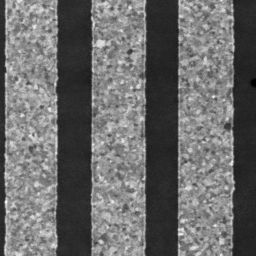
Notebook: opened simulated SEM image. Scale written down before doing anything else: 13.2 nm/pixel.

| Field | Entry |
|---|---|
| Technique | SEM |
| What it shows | one or a few lines or trenches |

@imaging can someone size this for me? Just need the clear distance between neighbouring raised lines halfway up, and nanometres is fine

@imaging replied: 469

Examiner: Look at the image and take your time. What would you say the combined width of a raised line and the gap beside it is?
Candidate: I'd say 1160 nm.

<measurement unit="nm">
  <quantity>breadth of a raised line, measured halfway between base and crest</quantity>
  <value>691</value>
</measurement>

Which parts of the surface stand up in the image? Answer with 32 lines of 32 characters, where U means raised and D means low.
DUUUUUUDDDDDUUUUUUDDDDDUUUUUUDDD
DUUUUUUDDDDDUUUUUUDDDDDUUUUUUDDD
DUUUUUUDDDDDUUUUUUDDDDDUUUUUUDDD
DUUUUUUDDDDDUUUUUUDDDDUUUUUUUDDD
DUUUUUUDDDDDUUUUUUDDDDUUUUUUUDDD
DUUUUUUDDDDDUUUUUUDDDDUUUUUUUDDD
DUUUUUUDDDDDUUUUUUDDDDUUUUUUUDDD
DUUUUUUDDDDDUUUUUUDDDDUUUUUUUDDD
DUUUUUUDDDDDUUUUUUDDDDUUUUUUUDDD
DUUUUUUDDDDDUUUUUUDDDDUUUUUUUDDD
DUUUUUUDDDDDUUUUUUDDDDUUUUUUUDDD
DUUUUUUDDDDDUUUUUUDDDDUUUUUUUDDD
DUUUUUUDDDDDUUUUUUDDDDUUUUUUUDDD
DUUUUUUDDDDDUUUUUUDDDDUUUUUUUDDD
DUUUUUUDDDDDUUUUUUDDDDUUUUUUUDDD
DUUUUUUDDDDDUUUUUUDDDDUUUUUUUDDD
DUUUUUUDDDDDUUUUUUDDDDUUUUUUUDDD
DUUUUUUDDDDDUUUUUUDDDDUUUUUUUDDD
DUUUUUUDDDDDUUUUUUDDDDUUUUUUUDDD
DUUUUUUDDDDDUUUUUUDDDDUUUUUUUDDD
DUUUUUUDDDDDUUUUUUDDDDUUUUUUUDDD
DUUUUUUDDDDDUUUUUUDDDDUUUUUUUDDD
DUUUUUUDDDDDUUUUUUDDDDUUUUUUUDDD
DUUUUUUDDDDDUUUUUUDDDDUUUUUUUDDD
DUUUUUUDDDDDUUUUUUDDDDUUUUUUUDDD
DUUUUUUDDDDDUUUUUUDDDDUUUUUUUDDD
DUUUUUUDDDDDUUUUUUDDDDUUUUUUUDDD
DUUUUUUDDDDDUUUUUUDDDDUUUUUUUDDD
DUUUUUUDDDDDUUUUUUDDDDUUUUUUUDDD
DUUUUUUDDDDDUUUUUUDDDDUUUUUUUDDD
DUUUUUUDDDDDUUUUUUDDDDUUUUUUUDDD
DUUUUUUDDDDDUUUUUUDDDDUUUUUUUDDD